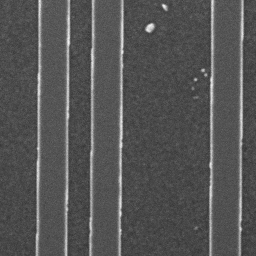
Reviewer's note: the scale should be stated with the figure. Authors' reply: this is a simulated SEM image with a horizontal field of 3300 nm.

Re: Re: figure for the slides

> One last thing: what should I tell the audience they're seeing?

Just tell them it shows lines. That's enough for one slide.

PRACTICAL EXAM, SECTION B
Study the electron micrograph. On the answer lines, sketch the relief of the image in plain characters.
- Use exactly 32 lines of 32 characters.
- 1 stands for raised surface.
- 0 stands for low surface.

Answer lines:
00000111100011100000000000011100
00000111100011100000000000011100
00000111100011100000000000011100
00000111100011100000000000011100
00000111100011100000000000011100
00000111100011100000000000011100
00000111100111100000000000011100
00000111100111100000000000011100
00000111100111100000000000011100
00000111100111100000000000111100
00000111100111100000000000111100
00000111100111100000000000111100
00000111100111100000000000111100
00000111100111100000000000111100
00000111100111100000000000111100
00000111000111100000000000111100
00000111000111100000000000111100
00000111000111100000000000111100
00000111000111100000000000111100
00000111000111100000000000111100
00000111000111100000000000111100
00000111000111100000000000111100
00000111000111100000000000111100
00000111000111100000000000111100
00000111000111100000000000111100
00000111000111100000000000111100
00000111000111100000000000111100
00000111000111100000000000111100
00000111000111100000000000111100
00000111000111100000000000111100
00000111000111100000000000111100
00000111000111100000000000111100